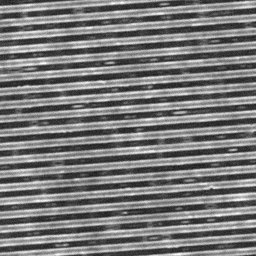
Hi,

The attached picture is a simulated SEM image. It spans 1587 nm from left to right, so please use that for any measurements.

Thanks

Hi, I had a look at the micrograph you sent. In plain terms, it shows parallel lines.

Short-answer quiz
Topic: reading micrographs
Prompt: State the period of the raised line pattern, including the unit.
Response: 0.0849 µm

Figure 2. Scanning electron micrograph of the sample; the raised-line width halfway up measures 42.5 nm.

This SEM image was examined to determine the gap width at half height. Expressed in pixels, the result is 6.98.